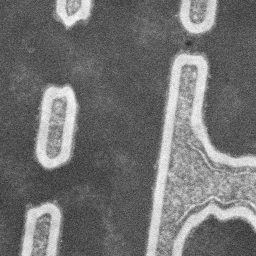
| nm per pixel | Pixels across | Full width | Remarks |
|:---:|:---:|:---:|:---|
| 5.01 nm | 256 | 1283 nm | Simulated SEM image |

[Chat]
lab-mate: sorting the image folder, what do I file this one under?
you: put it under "one or a few lines or trenches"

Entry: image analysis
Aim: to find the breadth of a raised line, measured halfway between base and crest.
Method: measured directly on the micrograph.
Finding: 134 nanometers